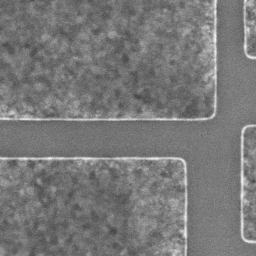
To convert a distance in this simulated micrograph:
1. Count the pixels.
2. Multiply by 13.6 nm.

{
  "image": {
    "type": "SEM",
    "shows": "wiring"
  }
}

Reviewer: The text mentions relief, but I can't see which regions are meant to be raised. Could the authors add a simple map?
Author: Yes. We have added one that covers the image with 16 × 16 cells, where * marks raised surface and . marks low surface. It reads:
*************..*
*************..*
*************..*
*************...
*************...
*************...
*************...
................
...............*
...............*
************...*
************...*
************...*
************...*
************...*
************....